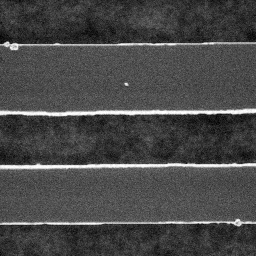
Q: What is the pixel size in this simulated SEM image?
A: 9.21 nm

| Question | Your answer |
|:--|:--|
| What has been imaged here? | lines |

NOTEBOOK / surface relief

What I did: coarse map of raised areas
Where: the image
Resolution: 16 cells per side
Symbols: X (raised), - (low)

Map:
----------------
----------------
----------------
XXXXXXXXXXXXXXXX
XXXXXXXXXXXXXXXX
XXXXXXXXXXXXXXXX
XXXXXXXXXXXXXXXX
----------------
----------------
----------------
XXXXXXXXXXXXXXXX
XXXXXXXXXXXXXXXX
XXXXXXXXXXXXXXXX
XXXXXXXXXXXXXXXX
----------------
----------------